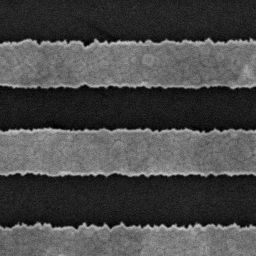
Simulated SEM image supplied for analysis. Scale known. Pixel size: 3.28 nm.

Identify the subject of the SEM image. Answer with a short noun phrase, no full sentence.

lines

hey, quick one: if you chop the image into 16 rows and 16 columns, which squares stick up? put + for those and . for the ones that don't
................
................
................
++++++++++++++++
++++++++++++++++
................
................
................
++++++++++++++++
++++++++++++++++
++++++++++++++++
................
................
................
++++++++++++++++
++++++++++++++++